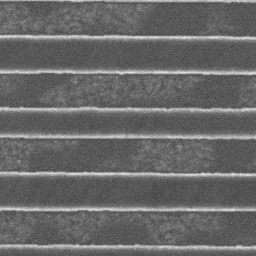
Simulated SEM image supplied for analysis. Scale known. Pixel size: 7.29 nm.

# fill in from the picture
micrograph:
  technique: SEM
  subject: lines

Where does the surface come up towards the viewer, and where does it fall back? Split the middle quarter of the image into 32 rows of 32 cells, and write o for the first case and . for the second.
oooooooooooooooooooooooooooooooo
oooooooooooooooooooooooooooooooo
................................
................................
................................
................................
................................
................................
................................
................................
................................
oooooooooooooooooooooooooooooooo
oooooooooooooooooooooooooooooooo
oooooooooooooooooooooooooooooooo
oooooooooooooooooooooooooooooooo
oooooooooooooooooooooooooooooooo
oooooooooooooooooooooooooooooooo
oooooooooooooooooooooooooooooooo
................................
................................
................................
................................
................................
................................
................................
................................
................................
oooooooooooooooooooooooo........
oooooooooooooooooooooooooooooooo
oooooooooooooooooooooooooooooooo
oooooooooooooooooooooooooooooooo
oooooooooooooooooooooooooooooooo